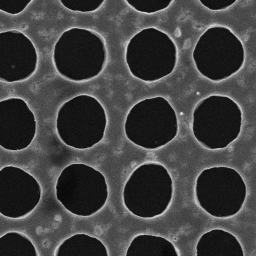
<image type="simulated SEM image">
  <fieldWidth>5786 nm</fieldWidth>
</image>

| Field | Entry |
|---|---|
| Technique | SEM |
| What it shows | a regular array of holes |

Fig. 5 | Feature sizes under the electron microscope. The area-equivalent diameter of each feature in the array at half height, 1.16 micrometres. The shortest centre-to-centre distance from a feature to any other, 1520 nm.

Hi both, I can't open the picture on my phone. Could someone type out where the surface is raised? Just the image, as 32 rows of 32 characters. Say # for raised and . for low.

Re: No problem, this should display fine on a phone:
...#####.....###.....####....###
#.##############################
################################
#########.################..####
...#####....#####....####....###
....###......###......###.....##
....###......###......##.......#
.....##......###......##......##
....###......###......###.....##
....####....#####....####....###
################################
################################
#..######...######...####....###
....###......####.....##......##
....###......###......##......##
....###......###......##......##
....###......###......##......##
....####.....###.....####....###
#..######..#######.#######..####
################################
#########.######################
...#####....#####....####.....##
....###......###.....####.....##
.....##......###......###......#
.....##......##......####......#
.....###.....###.....####.....##
....#####...####....######....##
################################
################################
...######..######..######....###
....####.....###.....####.....##
....###......###......###.....##